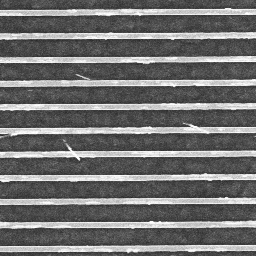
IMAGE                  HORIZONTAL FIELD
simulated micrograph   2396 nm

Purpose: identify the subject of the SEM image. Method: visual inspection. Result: parallel lines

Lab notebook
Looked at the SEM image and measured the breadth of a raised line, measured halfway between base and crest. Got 52.6 nm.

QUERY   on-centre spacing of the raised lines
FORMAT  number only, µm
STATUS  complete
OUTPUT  0.221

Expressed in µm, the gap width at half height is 0.168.